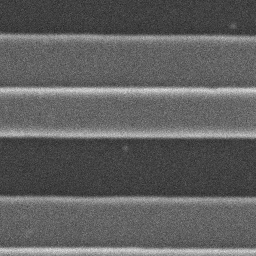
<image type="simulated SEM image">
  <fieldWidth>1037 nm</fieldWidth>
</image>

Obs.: lines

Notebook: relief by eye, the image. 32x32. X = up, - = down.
--------------------------------
--------------------------------
--------------------------------
--------------------------------
XXXXXXXXXXX---------------------
XXXXXXXXXXXXXXXXXXXXXXXXXXXXXXXX
XXXXXXXXXXXXXXXXXXXXXXXXXXXXXXXX
XXXXXXXXXXXXXXXXXXXXXXXXXXXXXXXX
XXXXXXXXXXXXXXXXXXXXXXXXXXXXXXXX
XXXXXXXXXXXXXXXXXXXXXXXXXXXXXXXX
XXXXXXXXXXXXXXXXXXXXXXXXXXXXXXXX
XXXXXXXXXXXXXXXXXXXXXXXXXXXXXXXX
XXXXXXXXXXXXXXXXXXXXXXXXXXXXXXXX
XXXXXXXXXXXXXXXXXXXXXXXXXXXXXXXX
XXXXXXXXXXXXXXXXXXXXXXXXXXXXXXXX
XXXXXXXXXXXXXXXXXXXXXXXXXXXXXXXX
XXXXXXXXXXXXXXXXXXXXXXXXXXXXXXXX
--------------------------------
--------------------------------
--------------------------------
--------------------------------
--------------------------------
--------------------------------
--------------------------------
--------------------------------
XXXXXXXXXXXXXXXXXXXXXXXXXXXXXXXX
XXXXXXXXXXXXXXXXXXXXXXXXXXXXXXXX
XXXXXXXXXXXXXXXXXXXXXXXXXXXXXXXX
XXXXXXXXXXXXXXXXXXXXXXXXXXXXXXXX
XXXXXXXXXXXXXXXXXXXXXXXXXXXXXXXX
XXXXXXXXXXXXXXXXXXXXXXXXXXXXXXXX
XXXXXXXXXXXXXXXXXXXXXXXXXXXXXXXX